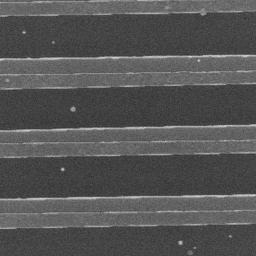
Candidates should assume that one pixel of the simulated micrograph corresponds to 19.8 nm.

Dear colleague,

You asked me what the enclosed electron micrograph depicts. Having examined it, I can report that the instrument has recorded lines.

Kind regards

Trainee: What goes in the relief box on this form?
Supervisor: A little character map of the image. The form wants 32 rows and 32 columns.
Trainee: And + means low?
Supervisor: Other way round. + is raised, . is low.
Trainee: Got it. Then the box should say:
++++++++++++++++++++++++++++++++
++++++++++++++++++++++++.+......
................................
................................
................................
................................
................................
++++++++++++++++++++++++++++++++
++++++++++++++++++++++++++++++++
++++++++++++++++++++++++++++++++
+++++++++++++++++++++++++++.....
................................
................................
................................
................................
................................
++++++++++++++++++++++++++++++++
++++++++++++++++++++++++++++++++
++++++++++++++++++++++++++++++++
+++++++.........................
................................
................................
................................
................................
........................++++++++
++++++++++++++++++++++++++++++++
++++++++++++++++++++++++++++++++
++++++++++++++++++++++++++++++++
+...............................
................................
................................
................................